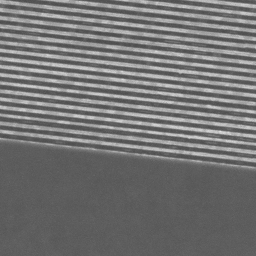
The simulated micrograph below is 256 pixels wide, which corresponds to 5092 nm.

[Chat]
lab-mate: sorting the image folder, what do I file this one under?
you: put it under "parallel lines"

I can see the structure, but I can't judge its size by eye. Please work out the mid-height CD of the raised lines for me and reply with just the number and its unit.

0.0667 micrometres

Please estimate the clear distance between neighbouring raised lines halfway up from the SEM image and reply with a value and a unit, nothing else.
104 nm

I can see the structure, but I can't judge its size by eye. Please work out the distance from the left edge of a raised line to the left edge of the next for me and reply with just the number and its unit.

8.05 pixels